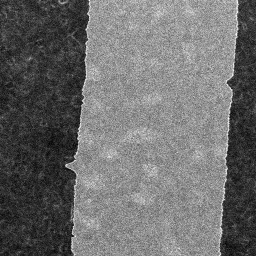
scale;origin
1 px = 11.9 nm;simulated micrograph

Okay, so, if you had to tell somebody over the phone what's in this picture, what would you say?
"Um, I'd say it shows one or a few lines or trenches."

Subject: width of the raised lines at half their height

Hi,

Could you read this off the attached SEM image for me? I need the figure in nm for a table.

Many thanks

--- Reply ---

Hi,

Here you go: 1750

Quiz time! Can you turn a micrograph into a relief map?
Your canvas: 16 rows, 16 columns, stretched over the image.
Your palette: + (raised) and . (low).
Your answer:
......+++++++++.
......+++++++++.
.....++++++++++.
.....++++++++++.
.....++++++++++.
.....+++++++++..
.....+++++++++..
.....+++++++++..
.....+++++++++..
.....+++++++++..
....++++++++++..
.....+++++++++..
.....+++++++++..
....++++++++++..
.....+++++++++..
.....+++++++++..